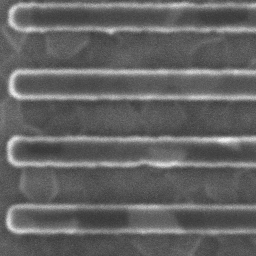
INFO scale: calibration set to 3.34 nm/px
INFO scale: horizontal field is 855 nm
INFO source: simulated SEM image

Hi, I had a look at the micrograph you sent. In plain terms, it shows one or a few lines or trenches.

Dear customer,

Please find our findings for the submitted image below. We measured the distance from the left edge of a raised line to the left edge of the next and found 224 nm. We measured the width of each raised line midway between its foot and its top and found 26 px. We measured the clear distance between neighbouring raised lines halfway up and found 136 nanometers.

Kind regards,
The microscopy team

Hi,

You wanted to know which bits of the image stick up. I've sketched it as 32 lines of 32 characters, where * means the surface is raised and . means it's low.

....*...........................
.*******************************
.*******************************
..******************************
................................
................................
................................
................................
................................
..******************************
.*******************************
..******************************
................................
................................
................................
................................
................................
..******************************
.*******************************
.*******************************
..***************..*************
................................
................................
................................
................................
................................
.*******************************
.*******************************
.*******************************
................................
................................
................................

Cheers